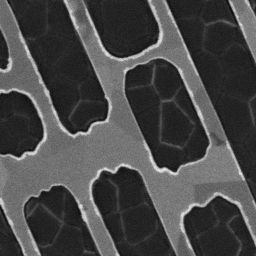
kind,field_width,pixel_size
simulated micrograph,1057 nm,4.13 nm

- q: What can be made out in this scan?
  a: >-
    one or a few lines or trenches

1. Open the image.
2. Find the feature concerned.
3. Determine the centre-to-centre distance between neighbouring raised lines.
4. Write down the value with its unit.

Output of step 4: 0.299 micrometres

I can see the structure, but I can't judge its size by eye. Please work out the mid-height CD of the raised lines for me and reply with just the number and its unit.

70.2 nm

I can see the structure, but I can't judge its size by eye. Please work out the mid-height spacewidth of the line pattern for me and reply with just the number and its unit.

221 nanometers